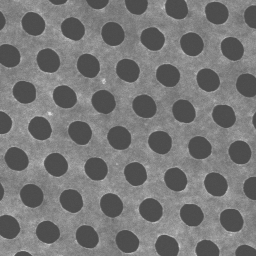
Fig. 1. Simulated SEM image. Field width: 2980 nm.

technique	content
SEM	a regular array of holes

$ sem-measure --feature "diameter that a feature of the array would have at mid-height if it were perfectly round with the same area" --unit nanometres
271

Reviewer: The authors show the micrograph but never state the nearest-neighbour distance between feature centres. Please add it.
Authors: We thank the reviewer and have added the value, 456 nanometres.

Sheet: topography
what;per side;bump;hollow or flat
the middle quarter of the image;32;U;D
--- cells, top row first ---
UUUDDDDDDUUUUDDDDDDUUUUUDDDDUUUU
UUUUDDDDDUUUUDDDDDDUUUUDDDDDDUUU
UUUUUDDDUUUUUDDDDDDUUUUDDDDDDUUU
UUUUUUUUUUUUUUDDDDUUUUUDDDDDDUUU
UUUUUUUUUUUUUUUUDUUUUUUUDDDDDUUU
UUUUUUUUUUUUUUUUUUUUUUUUUDDDUUUU
DDUUUUUUUDUUUUUUUUUUUUUUUUUUUUUU
DDDUUUUUDDDDUUUUUUUUUUUUUUUUUUUU
DDDUUUUDDDDDDUUUUUDDDDUUUUUUUUUU
DDDUUUUDDDDDDUUUUDDDDDDUUUUUDDDU
DDUUUUUDDDDDDUUUUDDDDDDUUUUDDDDD
UUUUUUUUDDDDUUUUUDDDDDDUUUUDDDDD
UUUUUUUUUUDUUUUUUUDDDDDUUUUDDDDD
UUUUUUUUUUUUUUUUUUUUDUUUUUUUDDDD
UUDDDUUUUUUUUUUUUUUUUUUUUUUUUDDD
UDDDDDUUUUUUUUUUUUUUUUUUUUUUUUUU
UDDDDDDUUUUUDDDDUUUUUUUUUUUUUUUU
UDDDDDDUUUUDDDDDUUUUUUDDDDUUUUUU
UUDDDDDUUUUDDDDDDUUUUDDDDDDUUUUU
UUUDDDUUUUUDDDDDDUUUUDDDDDDUUUUD
UUUUUUUUUUUUDDDDUUUUUDDDDDDUUUUD
UUUUUUUUUUUUUDUUUUUUUUDDDDUUUUUD
UUUUUUUUUUUUUUUUUUUUUUUUDUUUUUUU
UUUUUUUDDUUUUUUUUUUUUUUUUUUUUUUU
DUUUUDDDDDUUUUUUUUUUUUUUUUUUUUUU
DUUUUDDDDDDUUUUUDDDDUUUUUUUUUUUU
DUUUUDDDDDDUUUUDDDDDDUUUUUDDDUUU
UUUUUUDDDDDUUUUDDDDDDUUUUDDDDDUU
UUUUUUUDDDUUUUUDDDDDDUUUUDDDDDDU
UUUUUUUUUUUUUUUUDDDDUUUUUDDDDDDU
UUUUUUUUUUUUUUUUUUUUUUUUUUDDDDDU
DDDUUUUUUUUUUUUUUUUUUUUUUUUDDDUU